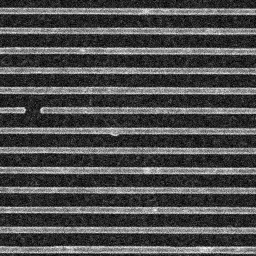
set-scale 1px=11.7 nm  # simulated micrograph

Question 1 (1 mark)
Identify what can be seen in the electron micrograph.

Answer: parallel lines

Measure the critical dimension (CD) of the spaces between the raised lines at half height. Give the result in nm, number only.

162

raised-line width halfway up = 65.9 nm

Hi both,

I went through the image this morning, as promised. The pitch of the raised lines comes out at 19.8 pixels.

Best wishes